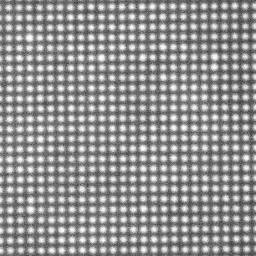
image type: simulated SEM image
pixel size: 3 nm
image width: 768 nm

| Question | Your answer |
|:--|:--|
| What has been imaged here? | a regular array of raised bodies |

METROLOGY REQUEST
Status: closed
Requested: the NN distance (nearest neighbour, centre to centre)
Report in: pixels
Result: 9.9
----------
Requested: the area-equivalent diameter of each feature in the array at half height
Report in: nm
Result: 14.4